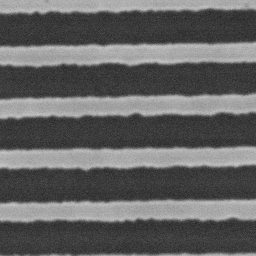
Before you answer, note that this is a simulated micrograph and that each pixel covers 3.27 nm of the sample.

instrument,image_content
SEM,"lines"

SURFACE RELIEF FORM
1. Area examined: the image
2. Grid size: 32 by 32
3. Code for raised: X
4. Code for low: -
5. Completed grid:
XXXXXXXXXXXXXXXXXXXXXXXXXXXXXXXX
XXXXXX--X-XX--X-----------------
--------------------------------
--------------------------------
--------------------------------
----------------------------XXXX
XXXXXXXXXXXXXXXXXXXXXXXXXXXXXXXX
XXXXXXXXXXXXXXXXXXXXXXXXXXXXXXXX
--------------------------------
--------------------------------
--------------------------------
--------------------------------
-XXXXXXXXXXXXXXXXXXXXXXXXXXXXXXX
XXXXXXXXXXXXXXXXXXXXXXXXXXXXXXXX
XXXXXX-XXX----------------------
--------------------------------
--------------------------------
--------------------------------
-----------------------------XXX
XXXXXXXXXXXXXXXXXXXXXXXXXXXXXXXX
XXXXXXXXXXXXXXXXXXXXXXXXXXXXXXXX
--------------------------------
--------------------------------
--------------------------------
--------------------------------
-XXXX-XXXXXXXXXXXXXXXXXXXXXXXXXX
XXXXXXXXXXXXXXXXXXXXXXXXXXXXXXXX
XXXXXXX-XXXXXXXXX--------X-X----
--------------------------------
--------------------------------
--------------------------------
--------------------------------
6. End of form